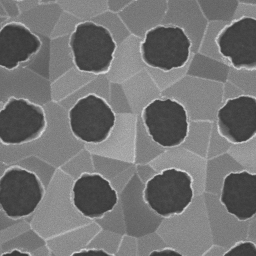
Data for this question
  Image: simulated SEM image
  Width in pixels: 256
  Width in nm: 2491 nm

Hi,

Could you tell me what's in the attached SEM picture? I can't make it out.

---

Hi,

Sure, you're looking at holes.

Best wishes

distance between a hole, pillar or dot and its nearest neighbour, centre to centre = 702 nanometres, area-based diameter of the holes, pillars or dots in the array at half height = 0.439 µm